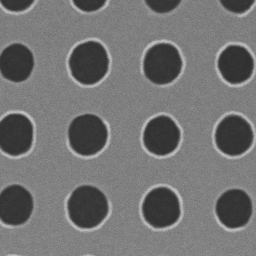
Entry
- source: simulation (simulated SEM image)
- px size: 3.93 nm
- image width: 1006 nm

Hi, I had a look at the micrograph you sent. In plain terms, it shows a regular array of holes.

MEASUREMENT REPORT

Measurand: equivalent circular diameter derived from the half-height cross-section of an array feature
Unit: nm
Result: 149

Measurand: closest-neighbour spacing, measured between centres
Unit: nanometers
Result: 282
